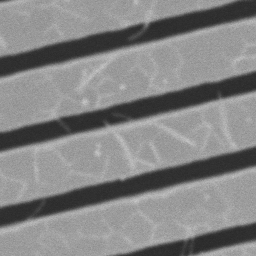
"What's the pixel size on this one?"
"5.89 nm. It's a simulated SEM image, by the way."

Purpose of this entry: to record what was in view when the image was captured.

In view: lines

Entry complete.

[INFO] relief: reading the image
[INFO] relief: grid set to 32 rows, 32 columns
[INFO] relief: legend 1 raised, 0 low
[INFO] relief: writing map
11111111111111111111111111110000
11111111111111111111111100000000
11111111111111111111000000000011
11111111111111110000000000111111
11111111111000000000001111111111
11111110000000000011111111111111
11100000000001111111111111111111
00000000011111111111111111111111
00000111111111111111111111111111
01111111111111111111111111111100
11111111111111111111111110000000
11111111111111111111100000000001
11111111111111111000000000011111
11111111111110000000000111111111
11111111000000000001111111111111
11110000000000011111111111111111
00000000000111111111111111111111
00000011111111111111111111111111
00111111111111111111111111111110
11111111111111111111111111100000
11111111111111111111111000000000
11111111111111111100000000000111
11111111111111000000000001111111
11111111110000000000011111111111
11111100000000000111111111111111
11000000000011111111111111111111
00000000111111111111111111111111
00011111111111111111111111111111
11111111111111111111111111110000
11111111111111111111111110000000
11111111111111111111000000000011
11111111111111110000000000111111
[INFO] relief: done